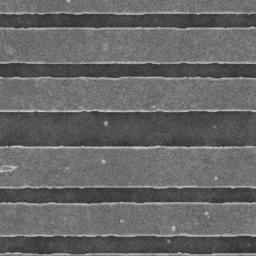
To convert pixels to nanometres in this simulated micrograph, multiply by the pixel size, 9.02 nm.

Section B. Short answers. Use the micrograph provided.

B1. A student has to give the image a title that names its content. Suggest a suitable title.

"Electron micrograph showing lines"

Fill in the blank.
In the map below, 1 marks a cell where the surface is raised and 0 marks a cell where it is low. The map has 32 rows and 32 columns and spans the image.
11111111111111111111111111111111
11111111111111111111111111111111
00000000000000000000000000000000
00000000000000000000000000000001
11111111111111111111111111111111
11111111111111111111111111111111
11111111111111111111111111111111
11111111111111111111111111111111
00000000000000000000000000000000
00000000000000000000000000000000
11111111111111111111111111111111
11111111111111111111111111111111
11111111111111111111111111111111
11111111111111111111111111111111
00000000000000000000000000000000
00000000000000000000000000000000
00000000000000000000000000000000
00000000000000000000000000000000
11111111111111111111111111111111
11111111111111111111111111111111
11111111111111111111111111111111
11111111111111111111111111111111
11111111111111111111111111111111
00000000000000000000000000000000
00000000000000000000000000000000
11111111111111111111111111111111
11111111111111111111111111111111
11111111111111111111111111111111
11111111111111111111111111111111
11011110011111111001110111111101
00000000000000000000000000000000
00000000000000000000000000000000